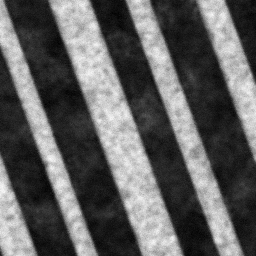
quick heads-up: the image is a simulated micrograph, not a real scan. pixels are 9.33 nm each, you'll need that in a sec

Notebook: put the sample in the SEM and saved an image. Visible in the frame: one or a few lines or trenches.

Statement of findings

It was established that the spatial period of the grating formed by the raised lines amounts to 0.629 µm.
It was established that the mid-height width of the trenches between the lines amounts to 409 nm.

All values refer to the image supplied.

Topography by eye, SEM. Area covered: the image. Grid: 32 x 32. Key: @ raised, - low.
------@@@@@-----@@@------@@@----
@------@@@@@----@@@------@@@----
@------@@@@@-----@@-------@@@---
@@-----@@@@@-----@@@------@@@---
@@------@@@@@-----@@------@@@@--
@@------@@@@@-----@@@------@@@--
@@@------@@@@-----@@@------@@@--
-@@------@@@@@-----@@------@@@@-
-@@------@@@@@-----@@@------@@@-
-@@@------@@@@@----@@@------@@@-
--@@------@@@@@-----@@------@@@@
--@@------@@@@@-----@@@------@@@
---@@------@@@@@----@@@------@@@
---@@------@@@@@-----@@@------@@
---@@@-----@@@@@-----@@@------@@
----@@------@@@@@-----@@------@@
----@@------@@@@@-----@@@------@
----@@@------@@@@@----@@@------@
-----@@------@@@@@-----@@------@
-----@@------@@@@@-----@@@------
------@@------@@@@@----@@@------
@-----@@------@@@@@-----@@------
@-----@@@-----@@@@@-----@@@-----
@------@@------@@@@@-----@@-----
@@-----@@------@@@@@-----@@@----
@@-----@@@------@@@@-----@@@----
@@@-----@@------@@@@@-----@@----
@@@-----@@------@@@@@-----@@@---
@@@-----@@@------@@@@@----@@@---
@@@@-----@@------@@@@@-----@@---
@@@@-----@@------@@@@@-----@@@--
@@@@------@@------@@@@@----@@@--